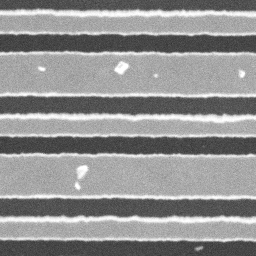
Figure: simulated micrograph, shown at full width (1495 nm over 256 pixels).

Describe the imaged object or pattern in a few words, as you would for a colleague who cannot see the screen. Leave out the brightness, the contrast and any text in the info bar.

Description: lines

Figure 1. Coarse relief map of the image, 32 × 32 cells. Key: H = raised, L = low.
LLLLLLLLLLLLLLLLLLLLLLLLLLLLLLLL
HLHHHHHLLLLLLLLLHHLHLLHLLHHHLLLL
HHHHHHHHHHHHHHHHHHHHHHHHHHHHHHHH
HHHHHHHHHHHHHHHHHHHHHHHHHHHHHHHH
LLLLLLLLLLLLLLLLLLLLLLLLLLLLLLLL
LLLLLLLLLLLLLLLLLLLLLLLLLLLLLLLL
LLLLLLLLLLLLLLLLLLLLLLLLLLLLLLLL
HHHHHHHHHHHHHHHHHHHHHHHHHHHHHHHH
HHHHHHHHHHHHHHHHHHHHHHHHHHHHHHHH
HHHHHHHHHHHHHHHHHHHHHHHHHHHHHHHH
HHHHHHHHHHHHHHHHHHHHHHHHHHHHHHHH
HHHHHHHHHHHHHHHHHHHHHHHHHHHHHHHH
LLLLLLLLLLLLLLLLLLLLLLLLLLLLLLLL
LLLLLLLLLLLLLLLLLLLLLLLLLLLLLLLL
HHHHHHHHHHHHHHHHLLHHHHHLLLLLLLLL
HHHHHHHHHHHHHHHHHHHHHHHHHHHHHHHH
HHHHHHHHHHHHHHHHHHHHHHHHHHHHHHHH
LLLLLLLLLLLLLLLLLLLLLLLLLLLLLLLL
LLLLLLLLLLLLLLLLLLLLLLLLLLLLLLLL
HHHHHHHHHHHHHHHHHHHHHHHHHHHHHHHH
HHHHHHHHHHHHHHHHHHHHHHHHHHHHHHHH
HHHHHHHHHHHHHHHHHHHHHHHHHHHHHHHH
HHHHHHHHHHHHHHHHHHHHHHHHHHHHHHHH
HHHHHHHHHHHHHHHHHHHHHHHHHHHHHHHH
HHHHHHHHHHHHHHHHHHHHHHHHHHHHHHHH
LLLLLLLLLLLLLLLLLLLLLLLLLLLLLLLL
LLLLLLLLLLLLLLLLLLLLLLLLLLLLLLLL
HHHHHHHHHHHHHHHHHHHHHHHHHHHHHHHH
HHHHHHHHHHHHHHHHHHHHHHHHHHHHHHHH
HHHHHHHHHHHHHHHHHHHHHHHHHHHHHHHH
LLLLLLLLLLLLLLLLLLLLLLLLLLLLLLLL
LLLLLLLLLLLLLLLLLLLLLLLLLLLLLLLL